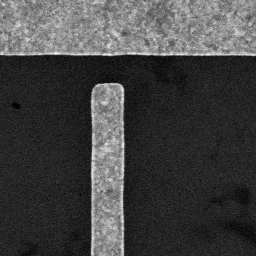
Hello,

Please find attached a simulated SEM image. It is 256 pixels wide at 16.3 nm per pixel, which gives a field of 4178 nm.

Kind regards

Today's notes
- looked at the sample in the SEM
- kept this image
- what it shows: wiring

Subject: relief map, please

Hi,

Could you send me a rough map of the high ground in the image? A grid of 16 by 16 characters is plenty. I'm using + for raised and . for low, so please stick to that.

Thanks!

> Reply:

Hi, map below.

++++++++++++++++
++++++++++++++++
++++++++++++++++
................
................
......+.........
......++........
......++........
......++........
......++........
......++........
......++........
......++........
......++........
......++........
......++........